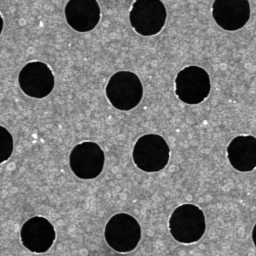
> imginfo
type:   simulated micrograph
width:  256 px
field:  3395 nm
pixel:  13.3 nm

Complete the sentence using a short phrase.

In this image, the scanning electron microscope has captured a regular array of holes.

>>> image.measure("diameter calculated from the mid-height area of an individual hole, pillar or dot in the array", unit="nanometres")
495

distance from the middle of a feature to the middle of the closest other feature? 0.884 microns